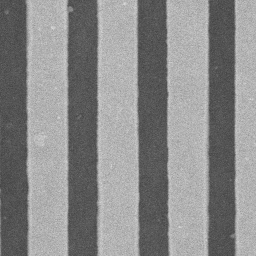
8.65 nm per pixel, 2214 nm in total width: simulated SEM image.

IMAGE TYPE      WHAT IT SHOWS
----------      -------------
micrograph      lines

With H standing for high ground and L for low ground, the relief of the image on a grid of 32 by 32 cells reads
LLLHHHHHLLLLHHHHHLLLLHHHHHLLLHHH
LLLHHHHHLLLLHHHHHLLLLHHHHHLLLHHH
LLLHHHHHLLLLHHHHHLLLLHHHHHLLLHHH
LLLHHHHHLLLLHHHHHLLLLHHHHHLLLHHH
LLLHHHHHLLLLHHHHHLLLLHHHHHLLLHHH
LLLHHHHHLLLLHHHHHLLLLHHHHHLLLHHH
LLLHHHHHLLLLHHHHHLLLLHHHHHLLLHHH
LLLHHHHHLLLLHHHHHLLLLHHHHHLLLHHH
LLLHHHHHLLLLHHHHHLLLLHHHHHLLLHHH
LLLHHHHHLLLLHHHHHLLLLHHHHHLLLHHH
LLLHHHHHLLLLHHHHHLLLLHHHHHLLLHHH
LLLHHHHHLLLLHHHHHLLLLHHHHHLLLHHH
LLLHHHHHLLLLHHHHHLLLLHHHHHLLLHHH
LLLHHHHHLLLLHHHHHLLLLHHHHHLLLHHH
LLLHHHHHLLLLHHHHHLLLLHHHHHLLLHHH
LLLHHHHHLLLLHHHHHLLLLHHHHHLLLHHH
LLLHHHHHLLLLHHHHHLLLLHHHHHLLLHHH
LLLHHHHHLLLLHHHHHLLLLHHHHHLLLHHH
LLLHHHHHLLLLHHHHHLLLLHHHHHLLLHHH
LLLHHHHHLLLLHHHHHLLLLHHHHHLLLHHH
LLLHHHHHLLLLHHHHHLLLLHHHHHLLLHHH
LLLHHHHHLLLLHHHHHLLLLHHHHHLLLHHH
LLLHHHHHLLLLHHHHHLLLLHHHHHLLLHHH
LLLLHHHHLLLLHHHHHLLLLHHHHHLLLHHH
LLLHHHHHLLLLHHHHHLLLLHHHHHLLLHHH
LLLHHHHHLLLLHHHHHLLLLHHHHHLLLLHH
LLLLHHHHLLLLHHHHHLLLLHHHHHLLLLHH
LLLLHHHHLLLLHHHHHLLLLHHHHHLLLHHH
LLLLHHHHLLLLHHHHHLLLLHHHHHLLLHHH
LLLLHHHHLLLLHHHHHLLLLHHHHHLLLHHH
LLLLHHHHLLLLHHHHHLLLLHHHHHLLLLHH
LLLLHHHHLLLLHHHHHLLLLHHHHHLLLHHH